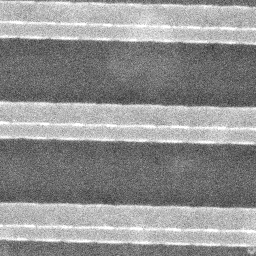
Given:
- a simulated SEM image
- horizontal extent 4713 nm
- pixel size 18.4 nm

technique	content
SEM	lines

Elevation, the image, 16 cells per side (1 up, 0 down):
1111111111111111
1111111111111111
0000000011111111
0000000000000000
0000000000000000
0000000000000000
1110000000000000
1111111111111111
1111111111111111
0000000000000000
0000000000000000
0000000000000000
0000000000000000
1111111111111111
1111111111111111
0000000000000000